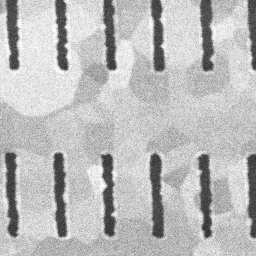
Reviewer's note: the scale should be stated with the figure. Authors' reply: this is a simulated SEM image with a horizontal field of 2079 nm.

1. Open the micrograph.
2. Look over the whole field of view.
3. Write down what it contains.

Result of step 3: holes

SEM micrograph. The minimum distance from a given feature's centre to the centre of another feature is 0.392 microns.